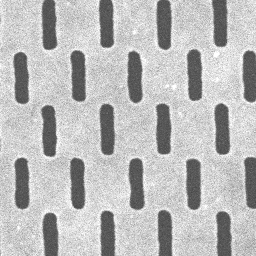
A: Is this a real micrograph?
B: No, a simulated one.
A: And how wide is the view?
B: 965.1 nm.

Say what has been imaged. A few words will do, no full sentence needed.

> a regular array of holes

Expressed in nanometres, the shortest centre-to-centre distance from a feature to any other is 214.